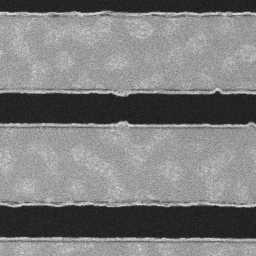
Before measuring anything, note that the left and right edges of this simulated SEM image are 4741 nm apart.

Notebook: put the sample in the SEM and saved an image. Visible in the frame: one or a few lines or trenches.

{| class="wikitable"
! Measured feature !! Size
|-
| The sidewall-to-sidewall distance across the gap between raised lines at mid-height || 1450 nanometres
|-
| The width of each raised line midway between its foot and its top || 636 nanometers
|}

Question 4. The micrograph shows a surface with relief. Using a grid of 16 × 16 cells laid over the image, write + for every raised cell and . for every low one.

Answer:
++++++++++++++++
................
................
................
................
................
++++++++++++++++
++++++++++++++++
................
................
................
................
................
++++++++++++++++
++++++++++++++++
................